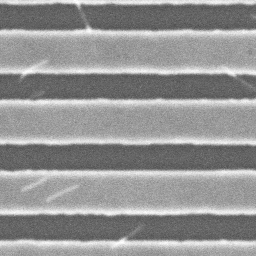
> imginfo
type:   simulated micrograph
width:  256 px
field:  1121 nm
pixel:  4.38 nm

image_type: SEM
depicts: lines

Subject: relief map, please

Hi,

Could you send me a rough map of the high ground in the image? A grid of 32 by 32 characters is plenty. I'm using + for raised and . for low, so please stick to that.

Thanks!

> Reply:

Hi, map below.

................................
................................
................................
................................
++++++++++++++++++++++++++++++++
++++++++++++++++++++++++++++++++
++++++++++++++++++++++++++++++++
++++++++++++++++++++++++++++++++
++++++++++++++++++++++++++++++++
................................
................................
................................
...........+++.....++....+..++++
++++++++++++++++++++++++++++++++
++++++++++++++++++++++++++++++++
++++++++++++++++++++++++++++++++
++++++++++++++++++++++++++++++++
++++++++++++++++++++++++++++++++
................................
................................
................................
+.++++++++++++++++++++++++++++++
++++++++++++++++++++++++++++++++
++++++++++++++++++++++++++++++++
++++++++++++++++++++++++++++++++
++++++++++++++++++++++++++++++++
++++++++++++++++++++++++++++++++
................................
................................
................................
++++++++++++++++++++++++++++++++
++++++++++++++++++++++++++++++++